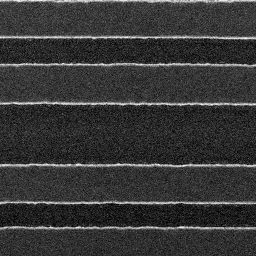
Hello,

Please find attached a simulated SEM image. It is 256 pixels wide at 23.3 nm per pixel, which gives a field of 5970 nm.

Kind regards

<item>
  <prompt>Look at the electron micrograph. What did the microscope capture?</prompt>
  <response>lines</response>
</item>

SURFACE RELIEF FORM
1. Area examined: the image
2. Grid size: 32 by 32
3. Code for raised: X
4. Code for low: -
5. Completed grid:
XXXXXXXXXXXXXXXXXXXXXXXXXXXXXXXX
XXXXXXXXXXXXXXXXXXXXXXXXXXXXXXXX
XXXXXXXXXXXXXXXXXXXXXXXXXXXXXXXX
XXXXXXXXXXXXXXXXXXXXXXXXXXXXXXXX
XXXXXXXXXXXXXXXXXXXXXXXXXXXXXXXX
--------------------------------
--------------------------------
--------------------------------
XXXXXXXXXXXXXXXXXXXXXXXXXXXXXXXX
XXXXXXXXXXXXXXXXXXXXXXXXXXXXXXXX
XXXXXXXXXXXXXXXXXXXXXXXXXXXXXXXX
XXXXXXXXXXXXXXXXXXXXXXXXXXXXXXXX
XXXXXXXXXXXXXXXXXXXXXXXXXXXXXXXX
--------------------------------
--------------------------------
--------------------------------
--------------------------------
--------------------------------
--------------------------------
--------------------------------
--------------------------------
XXXXXXXXXXXXXXXXXXXXXXXXXXXXXXXX
XXXXXXXXXXXXXXXXXXXXXXXXXXXXXXXX
XXXXXXXXXXXXXXXXXXXXXXXXXXXXXXXX
XXXXXXXXXXXXXXXXXXXXXXXXXXXXXXXX
--------------------------------
--------------------------------
--------------------------------
XXXX-X--X--X-XXXXXXX------------
XXXXXXXXXXXXXXXXXXXXXXXXXXXXXXXX
XXXXXXXXXXXXXXXXXXXXXXXXXXXXXXXX
XXXXXXXXXXXXXXXXXXXXXXXXXXXXXXXX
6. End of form